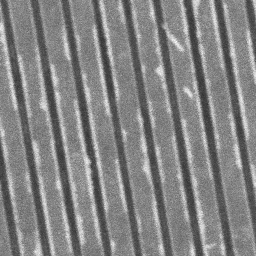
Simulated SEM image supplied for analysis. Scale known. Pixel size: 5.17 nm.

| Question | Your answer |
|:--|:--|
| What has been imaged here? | parallel lines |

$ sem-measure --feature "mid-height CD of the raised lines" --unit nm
112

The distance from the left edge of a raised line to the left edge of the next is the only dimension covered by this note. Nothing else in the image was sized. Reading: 0.156 micrometres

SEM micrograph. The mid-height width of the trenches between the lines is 9.01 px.